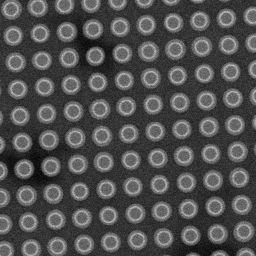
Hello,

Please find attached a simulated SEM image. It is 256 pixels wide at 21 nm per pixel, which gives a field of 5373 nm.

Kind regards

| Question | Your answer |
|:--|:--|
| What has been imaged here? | an array of small figures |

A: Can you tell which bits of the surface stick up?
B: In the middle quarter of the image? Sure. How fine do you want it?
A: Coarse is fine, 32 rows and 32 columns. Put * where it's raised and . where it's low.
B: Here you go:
***.............................
....................***...****..
.......***...****..*****..*****.
***...****...****..*****..*****.
****..*****..****..*****...***..
****..*****..****...***.........
****...***......................
.**.........................**..
..............***...****...****.
..*....****..*****..*****..****.
****...****..*****..*****..****.
*****.*****..*****..****...****.
*****..****...***.....*.........
****....**......................
............................***.
...............***...****..*****
.***....***...****..*****..*****
.****..*****..*****.*****..*****
*****..*****..****...****...**..
.****..*****...**...............
.***.....*......................
......................***...****
........****...****..*****..****
..***...****..*****..*****..****
.*****..****..*****..*****..****
.*****..****...****...***.......
.****...****....................
.............................***
................**....****..****
.........***...****...****..****
..****..*****..****...****..****
..****..*****..****...****...***